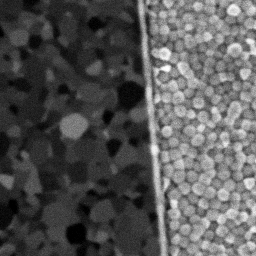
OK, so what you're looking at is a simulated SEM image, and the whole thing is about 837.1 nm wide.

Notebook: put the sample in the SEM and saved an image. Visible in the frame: one or a few lines or trenches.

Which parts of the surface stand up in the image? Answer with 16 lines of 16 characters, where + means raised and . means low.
+++++++++.......
+++++++++.......
+++++++++.......
+++++++++.......
+++++++++.......
+++++++++.......
+++++++++.......
++++++++++......
++++++++++......
++++++++++......
++++++++++......
++++++++++......
++++++++++......
++++++++++......
++++++++++......
++++++++++......